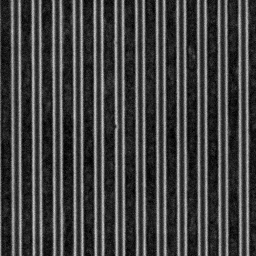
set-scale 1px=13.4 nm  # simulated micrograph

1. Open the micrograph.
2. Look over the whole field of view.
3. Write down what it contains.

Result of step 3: parallel lines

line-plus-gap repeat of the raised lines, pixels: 20.7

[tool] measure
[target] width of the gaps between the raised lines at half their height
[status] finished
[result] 12.6 pixels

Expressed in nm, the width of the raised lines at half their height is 109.